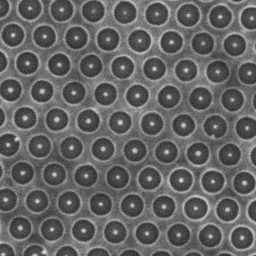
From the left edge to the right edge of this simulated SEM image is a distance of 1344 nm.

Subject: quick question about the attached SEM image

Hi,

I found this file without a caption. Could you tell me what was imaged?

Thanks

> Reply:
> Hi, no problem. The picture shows an array of small figures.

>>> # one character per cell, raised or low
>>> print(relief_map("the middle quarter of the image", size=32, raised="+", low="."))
..++......++......++.....+++....
.+++......++......++......++....
.++++....+++.....+++.....+++....
++++++.++++++...+++++...++++....
++..++++++.+++++++++++++++++++++
.....+++.....++++...+++++..+++++
.....+++.....+++.....+++.....+++
.....++......+++.....++......+++
.....+++.....++......++......++.
+...++++....++++.....+++.....++.
++++++++++.++++++...++++....++++
+++++..+++++++++++++++++++++++++
.+++....++++....++++....+++++..+
.++......++......++......+++....
.++......++......++......++.....
.++......++......++......++.....
++++....++++....++++....+++.....
+++++++++++++++++++++..+++++....
...++++++..+++++++++++++++++++++
....+++.....++++....++++...+++++
.....++......++......++.....+++.
.....++......++......++.....+++.
....+++......++......++......+..
...+++++....++++....+++.....+++.
+++++++++++++++++..+++++...+++++
++++...+++++..++++++++++++++++++
+++.....+++.....+++....+++++...+
.++.....+++.....+++.....+++.....
+++.....++......++......++......
+++.....+++.....+++.....++......
++++...++++....++++.....+++.....
+++++++++++++++++++++.++++++...+